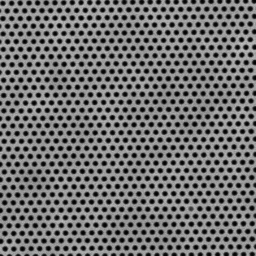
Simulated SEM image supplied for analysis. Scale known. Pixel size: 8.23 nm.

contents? a regular array of holes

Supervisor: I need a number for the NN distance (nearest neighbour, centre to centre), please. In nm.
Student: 68.4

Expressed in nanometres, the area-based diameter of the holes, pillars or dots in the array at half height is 46.5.